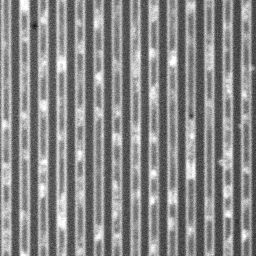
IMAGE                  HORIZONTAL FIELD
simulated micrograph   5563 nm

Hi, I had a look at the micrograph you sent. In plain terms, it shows parallel lines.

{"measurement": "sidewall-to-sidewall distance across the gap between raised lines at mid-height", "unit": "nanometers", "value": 206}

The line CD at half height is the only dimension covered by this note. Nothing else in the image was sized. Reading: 188 nm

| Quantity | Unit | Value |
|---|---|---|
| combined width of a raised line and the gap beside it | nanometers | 401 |